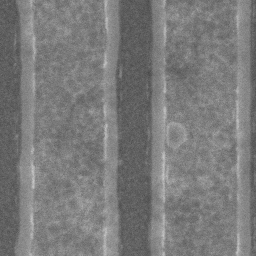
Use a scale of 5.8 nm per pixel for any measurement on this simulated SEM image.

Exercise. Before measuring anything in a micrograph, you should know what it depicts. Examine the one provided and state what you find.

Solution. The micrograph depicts one or a few lines or trenches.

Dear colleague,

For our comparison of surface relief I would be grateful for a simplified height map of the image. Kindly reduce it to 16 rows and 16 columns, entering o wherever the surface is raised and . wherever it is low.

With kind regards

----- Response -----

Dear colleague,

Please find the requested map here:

..ooooo...ooooo.
..ooooo...ooooo.
..ooooo...ooooo.
..ooooo...ooooo.
..ooooo...ooooo.
..ooooo...ooooo.
..ooooo...ooooo.
..ooooo...ooooo.
..ooooo...ooooo.
..ooooo...ooooo.
..ooooo...ooooo.
..ooooo...ooooo.
..ooooo...ooooo.
..ooooo...ooooo.
..ooooo...ooooo.
..ooooo...ooooo.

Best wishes